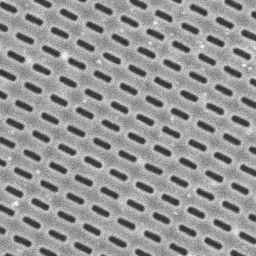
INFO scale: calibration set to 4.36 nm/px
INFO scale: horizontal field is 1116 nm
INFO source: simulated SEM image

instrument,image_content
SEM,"a regular array of holes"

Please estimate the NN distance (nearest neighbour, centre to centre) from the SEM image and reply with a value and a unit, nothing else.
88.1 nm